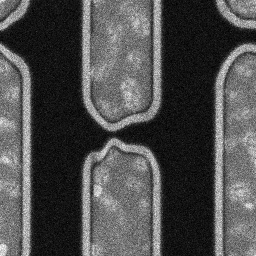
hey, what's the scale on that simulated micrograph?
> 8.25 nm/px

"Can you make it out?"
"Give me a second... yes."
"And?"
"one or a few lines or trenches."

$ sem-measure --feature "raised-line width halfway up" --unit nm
528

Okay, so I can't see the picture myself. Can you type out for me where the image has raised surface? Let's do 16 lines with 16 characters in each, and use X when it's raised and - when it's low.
-XXXX-----XXXX--
XXXXX-----XXXXXX
XXXXX-----XXXXXX
-XXXX-----XXXXX-
-XXXX-----XXXX--
--XXX-----XXXX--
--XXXX----XXXX--
--XXXX--XXXXXX--
--XXXXXXXXXXXX--
--XXXX---XXXXX--
--XXX-----XXXX--
--XXX-----XXXX--
--XXX-----XXXX--
--XXX-----XXXX--
--XXX-----XXXX--
--XXX-----XXXX--